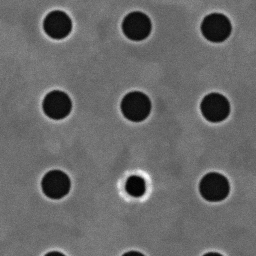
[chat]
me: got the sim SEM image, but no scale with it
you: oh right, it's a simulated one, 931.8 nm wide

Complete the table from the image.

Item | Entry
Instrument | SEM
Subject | a regular array of holes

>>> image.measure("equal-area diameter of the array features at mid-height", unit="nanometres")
113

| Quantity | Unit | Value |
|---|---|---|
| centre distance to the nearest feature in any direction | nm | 288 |